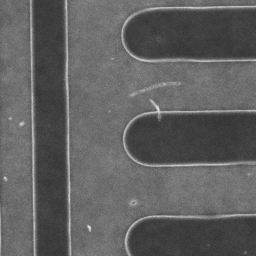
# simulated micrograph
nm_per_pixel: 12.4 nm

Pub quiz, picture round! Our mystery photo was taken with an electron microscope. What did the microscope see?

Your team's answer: groups of lines, slits or small figures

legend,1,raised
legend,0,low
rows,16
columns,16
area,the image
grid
0011000000011111
0011000011111111
0011000011111111
0011000011111111
0011000000000000
0011000000000000
0011000000000000
0011000011111111
0011000011111111
0011000011111111
0011000000000000
0011000000000000
0011000000000000
0011000000000011
0011000011111111
0011000011111111